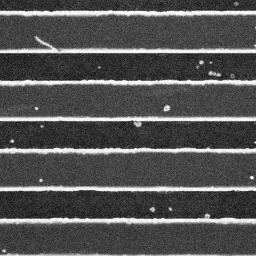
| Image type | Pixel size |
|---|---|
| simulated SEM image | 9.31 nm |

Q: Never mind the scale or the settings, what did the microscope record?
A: lines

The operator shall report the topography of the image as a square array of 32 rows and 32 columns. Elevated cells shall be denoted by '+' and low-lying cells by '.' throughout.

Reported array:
................................
.............++.................
++++++++++++++++++++++++++++++++
++++++++++++++++++++++++++++++++
++++++++++++++++++++++++++++++++
++++++++++++++++++++++++++++++++
+++....+.....+...+....+.........
................................
................................
................................
++++++++++++++++++++++++++++++++
++++++++++++++++++++++++++++++++
++++++++++++++++++++++++++++++++
++++++++++++++++++++++++++++++++
++++++++++++++++++++++++++++++++
................................
................................
................................
................................
++++++++++++++++++++++++++++++++
++++++++++++++++++++++++++++++++
++++++++++++++++++++++++++++++++
++++++++++++++++++++++++++++++++
++++++++++++++++++++++++++++++++
................................
................................
................................
......+++++++.++....+...++.+++..
++++++++++++++++++++++++++++++++
++++++++++++++++++++++++++++++++
++++++++++++++++++++++++++++++++
++++++++++++++++++++++++++++++++